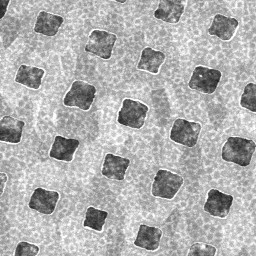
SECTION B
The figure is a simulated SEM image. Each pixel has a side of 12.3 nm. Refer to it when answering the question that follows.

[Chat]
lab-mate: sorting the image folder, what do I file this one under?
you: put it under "a regular array of holes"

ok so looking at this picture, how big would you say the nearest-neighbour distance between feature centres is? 669 nanometers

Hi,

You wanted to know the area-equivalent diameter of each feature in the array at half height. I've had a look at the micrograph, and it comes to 27.1 pixels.